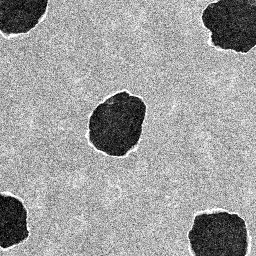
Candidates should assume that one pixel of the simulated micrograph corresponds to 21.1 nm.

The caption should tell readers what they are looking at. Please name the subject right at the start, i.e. holes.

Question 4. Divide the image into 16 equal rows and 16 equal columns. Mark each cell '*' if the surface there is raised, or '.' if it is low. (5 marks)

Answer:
...**********...
..***********...
*************...
****************
****************
****************
******...*******
******...*******
******...*******
******..********
****************
****************
.***************
..**********...*
..**********...*
************...*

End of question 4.